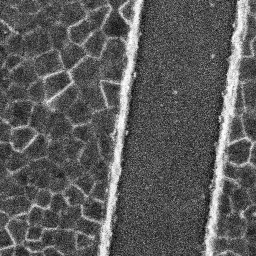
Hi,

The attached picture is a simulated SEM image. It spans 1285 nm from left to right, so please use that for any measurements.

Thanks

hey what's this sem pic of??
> one or a few lines or trenches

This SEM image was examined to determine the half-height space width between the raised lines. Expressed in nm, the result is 514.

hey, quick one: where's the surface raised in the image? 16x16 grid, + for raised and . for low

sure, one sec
+++++++++......+
++++++++.......+
++++++++.......+
++++++++.......+
++++++++......++
++++++++......++
++++++++......++
++++++++......++
++++++++......++
+++++++.......++
+++++++.......++
+++++++.......++
+++++++......+++
+++++++......+++
+++++++......+++
+++++++......+++